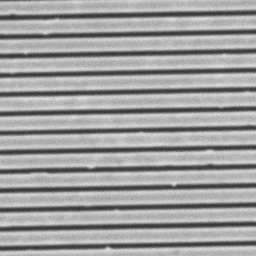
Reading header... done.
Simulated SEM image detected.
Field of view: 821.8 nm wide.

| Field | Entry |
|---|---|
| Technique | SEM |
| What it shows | parallel lines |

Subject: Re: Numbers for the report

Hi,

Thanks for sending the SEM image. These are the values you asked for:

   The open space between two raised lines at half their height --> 5.89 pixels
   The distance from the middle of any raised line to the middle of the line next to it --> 19.2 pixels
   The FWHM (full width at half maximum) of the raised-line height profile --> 13.9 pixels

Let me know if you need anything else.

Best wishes